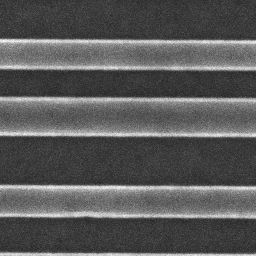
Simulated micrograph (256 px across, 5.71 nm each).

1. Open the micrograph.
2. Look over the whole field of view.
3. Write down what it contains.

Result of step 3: one or a few lines or trenches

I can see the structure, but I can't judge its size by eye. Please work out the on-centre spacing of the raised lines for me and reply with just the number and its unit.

73.5 px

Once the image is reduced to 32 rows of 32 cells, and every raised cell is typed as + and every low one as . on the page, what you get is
................................
................................
................................
................................
................................
++++++++++++++++++++++++++++++++
++++++++++++++++++++++++++++++++
++++++++++++++++++++++++++++++++
.............+++++++++++++++++++
................................
................................
................................
++++++++++++++++++++++++++++++++
++++++++++++++++++++++++++++++++
++++++++++++++++++++++++++++++++
++++++++++++++++++++++++++++++++
++++++++++++++++++++++++++++++++
................................
................................
................................
................................
................................
................................
+++++++++++++++++++++++++..+++.+
++++++++++++++++++++++++++++++++
++++++++++++++++++++++++++++++++
++++++++++++++++++++++++++++++++
................................
................................
................................
................................
................................